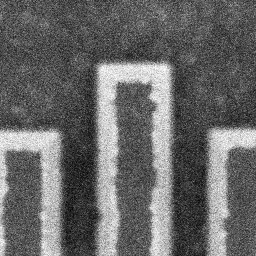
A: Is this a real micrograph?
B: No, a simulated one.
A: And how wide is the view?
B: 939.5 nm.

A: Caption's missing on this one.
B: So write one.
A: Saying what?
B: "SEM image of one or a few lines or trenches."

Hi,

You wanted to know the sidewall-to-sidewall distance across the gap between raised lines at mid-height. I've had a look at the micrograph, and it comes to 53.5 px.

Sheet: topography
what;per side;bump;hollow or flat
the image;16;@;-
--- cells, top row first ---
----------------
----------------
----------------
----------------
--------@@------
-------@@@------
-------@@@------
-------@@@------
-------@@@------
@@@----@@@----@@
@@@----@@@----@@
@@@----@@@----@@
@@@----@@@----@@
@@@----@@@----@@
@@@----@@@----@@
@@@----@@@----@@